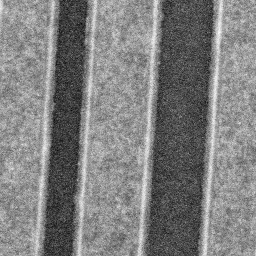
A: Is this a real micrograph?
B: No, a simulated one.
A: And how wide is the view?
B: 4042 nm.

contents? one or a few lines or trenches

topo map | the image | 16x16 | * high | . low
***...****....**
***...****....**
***...****....**
***...****....**
***...***.....**
***...***....***
***...***....***
***...***....***
***..****....***
***..****....***
***..****....***
***..****....***
***..****....***
**...****....***
**...****....***
**...****....***